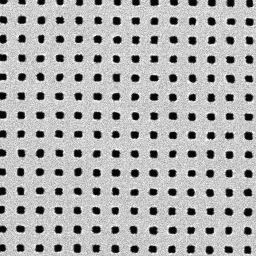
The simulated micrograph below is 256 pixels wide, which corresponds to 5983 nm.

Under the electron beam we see a regular array of holes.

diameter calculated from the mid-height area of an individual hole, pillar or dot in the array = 0.194 µm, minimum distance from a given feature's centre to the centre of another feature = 434 nm